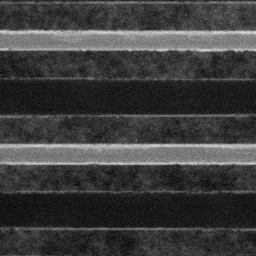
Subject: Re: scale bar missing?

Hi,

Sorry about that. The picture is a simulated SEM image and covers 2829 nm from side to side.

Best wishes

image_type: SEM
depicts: lines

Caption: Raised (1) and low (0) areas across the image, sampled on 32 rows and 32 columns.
00000000000000000000000000000000
00000000000000000000000000000000
00000000000000000000000000000000
00000000000000000000000000000000
11111111111111111111111111111111
11111111111111111111111111111111
00000000000000000000000000000000
00000000000000000000000000000000
00000000000000000000000000000000
00000000000000000000000000000000
11111111111111111111111111111111
11111111111111111111111111111111
11111111111111111111111111111111
11111111111111111111111111111111
11111110000000000000000000000000
00000000000000000000000000000000
00000000000000000000000000000000
00000000000000000000000000000000
11111111111111111111111111111111
11111111111111111111111111111111
00000000000000000000000000000000
00000000000000000000000000000000
00000000000000000000000000000000
00000000000000000000000000000000
11111111111111111111111111111111
11111111111111111111111111111111
11111111111111111111111111111111
11111111111111111111111111111111
10011111111111111111111111111111
00000000000000000000000000000000
00000000000000000000000000000000
00000000000000000000000000000000